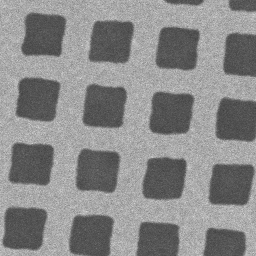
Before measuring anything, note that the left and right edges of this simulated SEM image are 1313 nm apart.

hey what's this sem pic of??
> a regular array of holes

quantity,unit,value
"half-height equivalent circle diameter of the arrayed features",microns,0.234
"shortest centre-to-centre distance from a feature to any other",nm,332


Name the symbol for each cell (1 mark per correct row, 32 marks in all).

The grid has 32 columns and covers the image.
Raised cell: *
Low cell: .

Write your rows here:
*********************....****...
********************************
***.....************************
***.....****.....***...*********
***.....***......***.....***....
***.....***.....****.....***....
***.....***.....****.....***....
***********.....***......***....
*********************...****....
******************************..
**.....*************************
**.....****.....****.***********
**.....****.....***.....****..**
**.....***......***.....***.....
**.....***......***.....***.....
***********....****.....***.....
*******************....****.....
*****************************...
**.....*************************
*......***.....*****************
*......***.....***.....*********
*.....****.....***.....***......
*.....****.....***.....***......
**********....****.....***.....*
******************.....***.....*
***************************....*
*.....**************************
*.....***.....******************
*.....***.....***.....**********
.....****.....***.....****.....*
.....****.....***.....****.....*
*********.....***.....***......*